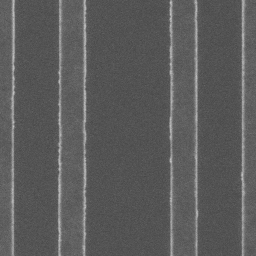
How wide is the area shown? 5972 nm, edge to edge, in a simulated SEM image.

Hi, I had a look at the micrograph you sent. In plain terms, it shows lines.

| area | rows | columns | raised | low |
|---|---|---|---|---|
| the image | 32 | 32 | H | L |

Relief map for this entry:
HHLLLLLLHHHLLLLLLLLLLHHHLLLLLLHH
HHLLLLLLHHHLLLLLLLLLLHHHHLLLLLHH
HHLLLLLLHHHLLLLLLLLLLHHHLLLLLLHH
HHLLLLLLHHHLLLLLLLLLLHHHHLLLLLHH
HHLLLLLLHHHLLLLLLLLLLHHHHLLLLLHH
HHLLLLLLHHHLLLLLLLLLLHHHHLLLLLHH
HHLLLLLLHHHLLLLLLLLLLHHHHLLLLLHH
HHLLLLLLHHHLLLLLLLLLLHHHHLLLLLHH
HHLLLLLLHHHLLLLLLLLLLHHHHLLLLLHH
HHLLLLLLHHHLLLLLLLLLLHHHHLLLLLHH
HHLLLLLLHHHLLLLLLLLLLHHHHLLLLLHH
HHLLLLLLHHHLLLLLLLLLLHHHHLLLLLHH
HHLLLLLLHHHLLLLLLLLLLHHHHLLLLLHH
HHLLLLLLHHHLLLLLLLLLLHHHHLLLLLHH
HHLLLLLLHHHLLLLLLLLLLHHHHLLLLLHH
HHLLLLLLHHHLLLLLLLLLLHHHHLLLLLHH
HHLLLLLLHHHLLLLLLLLLLHHHHLLLLLHH
HHLLLLLLHHHLLLLLLLLLLHHHHLLLLLHH
HHLLLLLLHHHLLLLLLLLLLHHHHLLLLLHH
HHLLLLLLHHHLLLLLLLLLLHHHHLLLLLHH
HHLLLLLHHHHLLLLLLLLLLHHHHLLLLLHH
HHLLLLLHHHHLLLLLLLLLLHHHHLLLLLHH
HHLLLLLHHHHLLLLLLLLLLHHHHLLLLLHH
HHLLLLLHHHHLLLLLLLLLLHHHHLLLLLHH
HHLLLLLHHHHLLLLLLLLLLHHHHLLLLLHH
HHLLLLLHHHHLLLLLLLLLLHHHHLLLLLHH
HHLLLLLHHHHLLLLLLLLLLHHHHLLLLLHH
HHLLLLLHHHHLLLLLLLLLLHHHHLLLLLHH
HHLLLLLHHHHLLLLLLLLLLHHHHLLLLLHH
HHLLLLLHHHHLLLLLLLLLLHHHHLLLLLHH
HHLLLLLHHHHLLLLLLLLLLHHHHLLLLLHH
HHLLLLLHHHHLLLLLLLLLLHHHHLLLLLHH